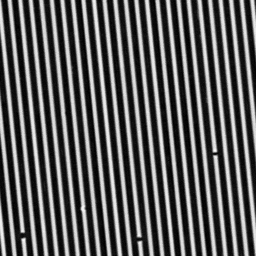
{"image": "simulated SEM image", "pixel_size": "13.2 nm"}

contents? parallel lines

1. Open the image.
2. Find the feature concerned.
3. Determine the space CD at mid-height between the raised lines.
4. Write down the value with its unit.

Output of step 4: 84 nm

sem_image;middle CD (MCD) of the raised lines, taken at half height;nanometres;47.7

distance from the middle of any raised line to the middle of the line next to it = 10.5 pixels